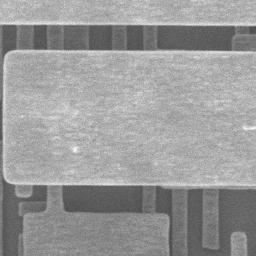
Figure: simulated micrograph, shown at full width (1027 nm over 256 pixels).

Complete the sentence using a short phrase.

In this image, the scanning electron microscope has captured wiring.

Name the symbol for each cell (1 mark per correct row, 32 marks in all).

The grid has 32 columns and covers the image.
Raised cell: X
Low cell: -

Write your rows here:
XXXXXXXXXXXXXXXXXXXXXXXXXXXXXXXX
XXXXXXXXXXXXXXXXXXXXXXXXXXXXXXXX
XXXXXXXXXXXXXXXXXXXXXXXXXXXXXXXX
--------------------------------
--------------------------------
--------------------------------
-XXXXXXXXXXXXXXXXXXXXXXXXXX-----
-XXXXXXXXXXXXXXXXXXXXXXXXXXXXXXX
XXXXXXXXXXXXXXXXXXXXXXXXXXXXXXXX
XXXXXXXXXXXXXXXXXXXXXXXXXXXXXXXX
XXXXXXXXXXXXXXXXXXXXXXXXXXXXXXXX
XXXXXXXXXXXXXXXXXXXXXXXXXXXXXXXX
XXXXXXXXXXXXXXXXXXXXXXXXXXXXXXXX
XXXXXXXXXXXXXXXXXXXXXXXXXXXXXXXX
XXXXXXXXXXXXXXXXXXXXXXXXXXXXXXXX
XXXXXXXXXXXXXXXXXXXXXXXXXXXXXXXX
XXXXXXXXXXXXXXXXXXXXXXXXXXXXXXXX
XXXXXXXXXXXXXXXXXXXXXXXXXXXXXXXX
XXXXXXXXXXXXXXXXXXXXXXXXXXXXXXXX
XXXXXXXXXXXXXXXXXXXXXXXXXXXXXXXX
XXXXXXXXXXXXXXXXXXXXXXXXXXXXXXXX
XXXXXXXXXXXXXXXXXXXXXXXXXXXXXXXX
-XXXXXXXXXXXXXXXXXXXXXXXXXXXXXXX
--------------------------------
--------------------------------
--------------------------------
--------------------------------
--------------------------------
--------------------------------
--------------------------------
--------------------------------
--------------------------------